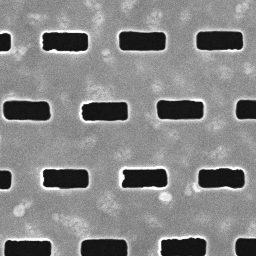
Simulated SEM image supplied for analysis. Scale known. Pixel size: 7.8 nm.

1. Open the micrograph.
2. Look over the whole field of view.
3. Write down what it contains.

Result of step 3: a regular array of holes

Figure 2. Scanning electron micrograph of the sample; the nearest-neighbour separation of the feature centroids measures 0.6 micrometres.